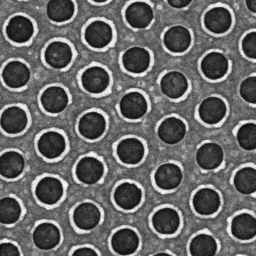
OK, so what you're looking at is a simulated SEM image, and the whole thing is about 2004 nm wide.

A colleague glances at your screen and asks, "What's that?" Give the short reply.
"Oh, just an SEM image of a regular array of holes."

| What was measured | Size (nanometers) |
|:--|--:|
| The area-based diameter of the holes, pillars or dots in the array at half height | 219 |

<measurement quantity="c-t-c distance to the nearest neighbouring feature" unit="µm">0.352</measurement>